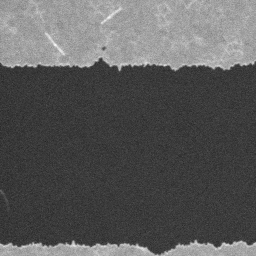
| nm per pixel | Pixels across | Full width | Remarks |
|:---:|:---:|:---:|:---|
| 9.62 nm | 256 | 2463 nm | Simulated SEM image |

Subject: one or a few lines or trenches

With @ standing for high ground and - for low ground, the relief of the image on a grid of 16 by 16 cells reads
@@@@@@@@@@@@@@@@
@@@@@@@@@@@@@@@@
@@@@@@@@@@@@@@@@
@@@@@@@@@@@@@@@@
----------------
----------------
----------------
----------------
----------------
----------------
----------------
----------------
----------------
----------------
----------------
@@@@@@@@@--@@@@@